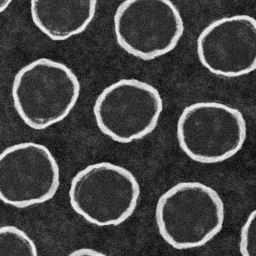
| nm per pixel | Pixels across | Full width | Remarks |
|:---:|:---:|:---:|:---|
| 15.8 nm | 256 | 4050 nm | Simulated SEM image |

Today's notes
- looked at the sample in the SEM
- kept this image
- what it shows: raised bodies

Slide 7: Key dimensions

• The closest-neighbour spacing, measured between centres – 85.8 px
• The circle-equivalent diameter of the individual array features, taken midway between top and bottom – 60.9 px